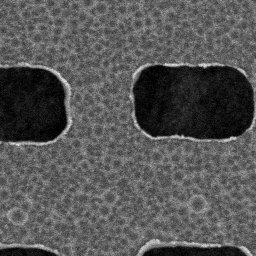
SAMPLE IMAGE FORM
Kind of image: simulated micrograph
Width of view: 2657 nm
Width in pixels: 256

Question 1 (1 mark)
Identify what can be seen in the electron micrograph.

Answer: holes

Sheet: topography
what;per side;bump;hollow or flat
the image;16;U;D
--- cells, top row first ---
UUUUUUUUUUUUUUUU
UUUUUUUUUUUUUUUU
UUUUUUUUUUUUUUUU
UUUUUUUUUUUUUUUU
DDDUUUUUUDDDDDDU
DDDDUUUUDDDDDDDD
DDDDUUUUDDDDDDDD
DDDDUUUUUDDDDDDD
DDDDUUUUUUUDDDDU
UUUUUUUUUUUUUUUU
UUUUUUUUUUUUUUUU
UUUUUUUUUUUUUUUU
UUUUUUUUUUUUUUUU
UUUUUUUUUUUUUUUU
UUUUUUUUUUUUUUUU
DDUUUUUUUDDDDDDU